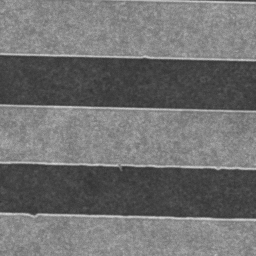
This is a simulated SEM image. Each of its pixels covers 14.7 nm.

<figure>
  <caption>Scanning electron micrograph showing one or a few lines or trenches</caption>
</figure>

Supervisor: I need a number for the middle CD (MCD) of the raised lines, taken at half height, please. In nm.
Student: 845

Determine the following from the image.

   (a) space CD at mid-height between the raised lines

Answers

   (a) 51.2 px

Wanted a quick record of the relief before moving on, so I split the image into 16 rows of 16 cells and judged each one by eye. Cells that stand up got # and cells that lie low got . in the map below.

################
################
################
......##########
................
................
................
################
################
################
..............##
................
................
######..........
################
################